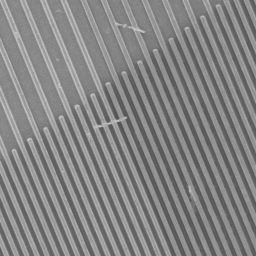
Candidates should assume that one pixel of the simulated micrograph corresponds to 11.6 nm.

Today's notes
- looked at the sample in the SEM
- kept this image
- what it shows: parallel lines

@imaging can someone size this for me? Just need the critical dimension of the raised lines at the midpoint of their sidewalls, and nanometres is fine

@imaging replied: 53.5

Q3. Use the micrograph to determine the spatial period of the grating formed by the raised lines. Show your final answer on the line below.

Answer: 109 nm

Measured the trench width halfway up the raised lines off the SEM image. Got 54.9 nm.